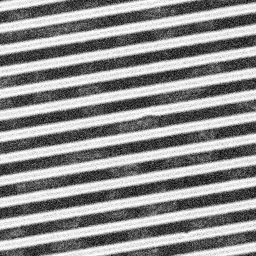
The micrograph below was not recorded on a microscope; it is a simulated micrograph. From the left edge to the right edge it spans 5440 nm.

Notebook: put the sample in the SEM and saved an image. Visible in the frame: parallel lines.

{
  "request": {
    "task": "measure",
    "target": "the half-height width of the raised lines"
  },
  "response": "160 nm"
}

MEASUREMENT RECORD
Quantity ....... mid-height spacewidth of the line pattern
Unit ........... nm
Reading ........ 286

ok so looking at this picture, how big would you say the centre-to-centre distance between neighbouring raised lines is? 0.456 um